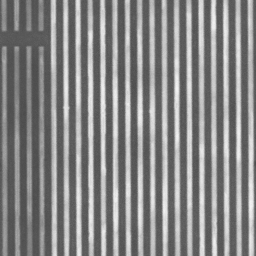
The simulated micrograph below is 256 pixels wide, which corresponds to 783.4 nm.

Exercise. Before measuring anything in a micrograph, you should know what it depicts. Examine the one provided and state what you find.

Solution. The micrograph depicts parallel lines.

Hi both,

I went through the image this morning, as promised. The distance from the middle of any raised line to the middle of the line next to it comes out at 37.6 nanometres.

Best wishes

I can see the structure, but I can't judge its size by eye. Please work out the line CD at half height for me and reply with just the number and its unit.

13 nm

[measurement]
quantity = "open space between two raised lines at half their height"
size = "23.7 nm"